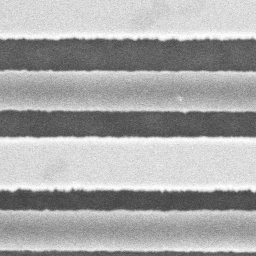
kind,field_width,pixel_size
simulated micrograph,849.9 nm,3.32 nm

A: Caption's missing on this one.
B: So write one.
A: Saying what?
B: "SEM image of lines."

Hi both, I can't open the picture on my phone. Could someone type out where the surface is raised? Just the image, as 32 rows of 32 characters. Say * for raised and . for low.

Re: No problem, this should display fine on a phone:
********************************
********************************
********************************
********************************
********************************
................................
................................
................................
................................
********************************
********************************
********************************
********************************
********************************
................................
................................
................................
********************************
********************************
********************************
********************************
********************************
********************************
********************************
................................
................................
********************************
********************************
********************************
********************************
********************************
................................